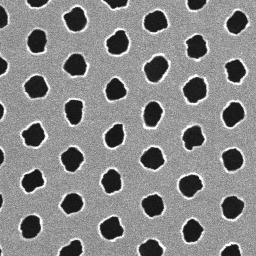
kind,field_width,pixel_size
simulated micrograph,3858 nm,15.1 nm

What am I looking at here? a regular array of holes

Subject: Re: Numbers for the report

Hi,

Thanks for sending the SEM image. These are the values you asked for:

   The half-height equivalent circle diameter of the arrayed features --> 333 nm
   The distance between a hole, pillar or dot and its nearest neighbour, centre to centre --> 668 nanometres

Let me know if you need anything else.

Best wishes